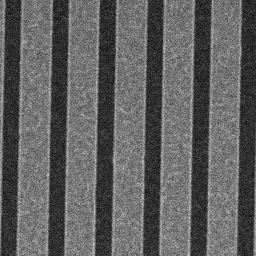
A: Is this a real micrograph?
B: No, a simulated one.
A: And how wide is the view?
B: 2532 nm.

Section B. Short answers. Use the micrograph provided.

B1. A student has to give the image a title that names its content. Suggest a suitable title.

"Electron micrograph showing parallel lines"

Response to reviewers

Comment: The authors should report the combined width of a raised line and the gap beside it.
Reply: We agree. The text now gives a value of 469 nm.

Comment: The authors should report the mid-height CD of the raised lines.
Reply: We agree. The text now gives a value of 29.1 px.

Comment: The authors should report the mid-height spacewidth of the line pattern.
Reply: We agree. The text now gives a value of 174 nanometers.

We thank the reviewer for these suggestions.